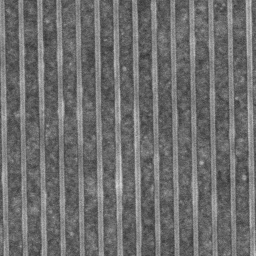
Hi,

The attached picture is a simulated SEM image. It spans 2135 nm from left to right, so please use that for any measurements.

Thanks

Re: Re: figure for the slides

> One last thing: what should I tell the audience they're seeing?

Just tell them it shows parallel lines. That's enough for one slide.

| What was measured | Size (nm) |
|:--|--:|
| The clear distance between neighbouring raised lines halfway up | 123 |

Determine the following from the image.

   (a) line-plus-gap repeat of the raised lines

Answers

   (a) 19 pixels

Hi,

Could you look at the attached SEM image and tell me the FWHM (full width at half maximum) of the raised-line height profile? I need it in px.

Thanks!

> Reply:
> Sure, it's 4.24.